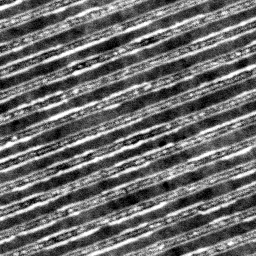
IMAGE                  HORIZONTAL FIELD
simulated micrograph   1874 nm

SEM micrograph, parallel lines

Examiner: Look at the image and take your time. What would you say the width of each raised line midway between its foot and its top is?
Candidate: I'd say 103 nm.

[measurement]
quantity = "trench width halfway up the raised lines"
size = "57.4 nm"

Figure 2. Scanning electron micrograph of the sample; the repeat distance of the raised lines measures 160 nm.